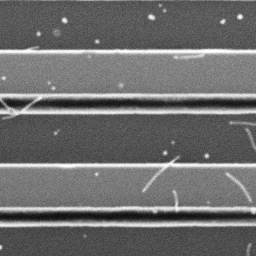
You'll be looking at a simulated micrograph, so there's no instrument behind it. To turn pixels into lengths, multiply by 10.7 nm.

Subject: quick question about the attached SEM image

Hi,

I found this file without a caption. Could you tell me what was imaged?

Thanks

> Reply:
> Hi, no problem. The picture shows lines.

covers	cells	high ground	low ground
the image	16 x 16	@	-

----------------
----------------
----------------
@@@@@@@@@@@@@@@@
@@@@@@@@@@@@@@@@
@@@@@@@@@@@@@@@@
@@@@@@@@@@@@@@@@
----------------
----------------
----------------
@@@@@@@@@@@@@@@@
@@@@@@@@@@@@@@@@
@@@@@@@@@@@@@@@@
@@@@@@@@@@@@@@@@
----------------
----------------